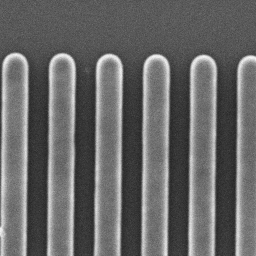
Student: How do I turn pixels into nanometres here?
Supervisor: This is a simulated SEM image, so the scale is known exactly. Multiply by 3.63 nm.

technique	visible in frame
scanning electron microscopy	groups of lines, slits or small figures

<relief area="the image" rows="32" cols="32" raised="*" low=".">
................................
................................
................................
................................
................................
................................
................................
.**....**....**...***...***...**
***...***...***...***...***...**
***...***...***...***...***...**
***...***...***...***...***...**
***...***...***...***...***...**
***...***...***...***...***...**
***...***...***...***...***...**
***...***...***...***...***...**
***...***...***...***...***...**
***...***...***...***...***...**
***...***...***...***...***...**
***...***...***...***...***...**
***...***...***...***...***...**
***...***...***...***...***...**
***...***...***...***...***...**
***...***...***...***...***...**
***...***...***...***...***...**
***...***...***...***...***...**
***...***...***...***...***...**
***...***...***...***...***...**
***...***...***...***...***...**
***...***...***...***...***...**
***...***...***...***...***...**
***...***...***...***...***...**
***...***...***...***...***...**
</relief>